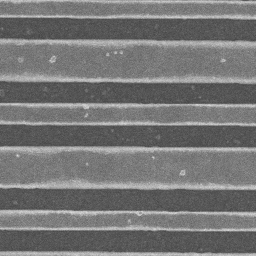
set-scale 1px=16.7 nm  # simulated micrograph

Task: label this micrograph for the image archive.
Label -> lines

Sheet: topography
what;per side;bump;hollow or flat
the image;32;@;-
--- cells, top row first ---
@@@@@@@@@@@@@@@@@@@@@@@@@@@@@@@@
@@@@@@@@@@@@@@@@@@@@@@@@@@@@@@@@
--------------------------------
--------------------------------
--------------------------------
@@@@@@@@@@@@@@@@@@@@@@@@@@@@@@@@
@@@@@@@@@@@@@@@@@@@@@@@@@@@@@@@@
@@@@@@@@@@@@@@@@@@@@@@@@@@@@@@@@
@@@@@@@@@@@@@@@@@@@@@@@@@@@@@@@@
@@@@@@@@@@@@@@@@@@@@@@@@@@@@@@@@
--------------------------------
--------------------------------
--------------------------------
@@@@@@@@@@@@@@@@@@@@@@@@@@@@@@@@
@@@@@@@@@@@@@@@@@@@@@@@@@@@@@@@@
----@@-@@@@@@@@@@@@@@@@@@@@@@@@@
--------------------------------
--------------------------------
@@@@@@@@@@@@@@@@@@@@@@@@@@@@@@@@
@@@@@@@@@@@@@@@@@@@@@@@@@@@@@@@@
@@@@@@@@@@@@@@@@@@@@@@@@@@@@@@@@
@@@@@@@@@@@@@@@@@@@@@@@@@@@@@@@@
@@@@@@@@@@@@@@@@@@@@@@@@@@@@@@@@
---@-------@@-@@@@@@@@@@@@@@@@@@
--------------------------------
--------------------------------
@@@@@@@@@@@@@@@@@@@@--@@--------
@@@@@@@@@@@@@@@@@@@@@@@@@@@@@@@@
@@@@@@@@@@@@@@@@@@@@@@@@@@@@@@@@
--------------------------------
--------------------------------
@@@@@-@@@--@--------------------